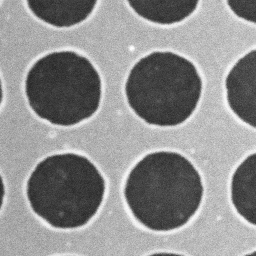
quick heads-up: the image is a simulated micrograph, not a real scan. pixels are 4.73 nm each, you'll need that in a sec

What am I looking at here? holes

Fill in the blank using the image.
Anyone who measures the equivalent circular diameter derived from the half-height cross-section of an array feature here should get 362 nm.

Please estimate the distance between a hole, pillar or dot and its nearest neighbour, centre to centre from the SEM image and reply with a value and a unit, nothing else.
467 nanometers